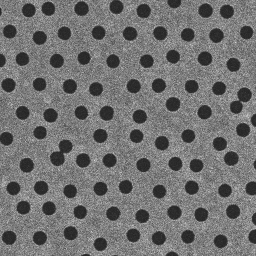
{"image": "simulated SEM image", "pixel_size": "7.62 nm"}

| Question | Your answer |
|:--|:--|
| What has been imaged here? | a regular array of holes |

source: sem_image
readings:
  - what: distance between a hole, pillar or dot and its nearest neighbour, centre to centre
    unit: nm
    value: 196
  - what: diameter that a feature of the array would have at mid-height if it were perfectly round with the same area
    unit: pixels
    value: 14.3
